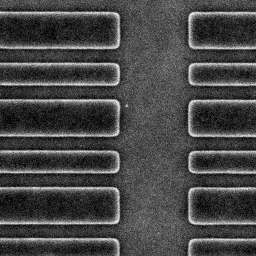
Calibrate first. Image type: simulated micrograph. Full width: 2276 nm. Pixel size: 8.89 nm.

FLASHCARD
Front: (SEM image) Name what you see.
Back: groups of lines, slits or small figures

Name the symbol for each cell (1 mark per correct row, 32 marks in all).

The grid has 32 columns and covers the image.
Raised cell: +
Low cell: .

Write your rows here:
................................
................................
+++++++++++++++.........++++++++
+++++++++++++++.........++++++++
+++++++++++++++.........++++++++
+++++++++++++++.........++++++++
................................
................................
+++++++++++++++.........++++++++
+++++++++++++++.........++++++++
++++++++++++++..........++++++++
................................
................................
+++++++++++++++.........++++++++
+++++++++++++++.........++++++++
+++++++++++++++.........++++++++
+++++++++++++++.........++++++++
................................
................................
+++++++++++++++.........++++++++
+++++++++++++++.........++++++++
++++++++++++++..........++++++++
................................
+++++.++..++++..................
+++++++++++++++.........++++++++
+++++++++++++++.........++++++++
+++++++++++++++.........++++++++
+++++++++++++++.........++++++++
................................
................................
+++++++++++++++.........++++++++
+++++++++++++++.........++++++++